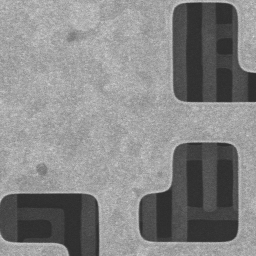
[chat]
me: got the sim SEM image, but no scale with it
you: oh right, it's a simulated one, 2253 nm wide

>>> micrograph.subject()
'wiring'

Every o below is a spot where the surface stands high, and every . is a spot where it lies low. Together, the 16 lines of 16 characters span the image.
ooooooooooo....o
ooooooooooo....o
ooooooooooo....o
ooooooooooo....o
ooooooooooo.....
ooooooooooo.....
oooooooooooooooo
oooooooooooooooo
oooooooooooooooo
ooooooooooo....o
ooooooooooo....o
ooooooooooo....o
......ooo......o
......ooo......o
......ooo......o
oooo..oooooooooo